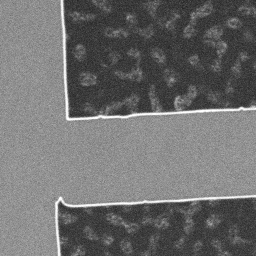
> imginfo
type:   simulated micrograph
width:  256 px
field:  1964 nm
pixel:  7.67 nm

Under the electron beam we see one or a few lines or trenches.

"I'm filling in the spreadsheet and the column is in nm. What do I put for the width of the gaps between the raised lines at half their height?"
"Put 665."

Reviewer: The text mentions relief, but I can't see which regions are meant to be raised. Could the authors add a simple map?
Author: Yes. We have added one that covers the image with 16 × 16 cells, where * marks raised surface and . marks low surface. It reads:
....************
....************
....************
....************
....************
....************
....************
................
................
................
................
................
............****
....************
....************
....************